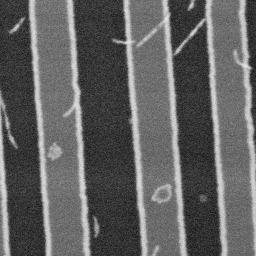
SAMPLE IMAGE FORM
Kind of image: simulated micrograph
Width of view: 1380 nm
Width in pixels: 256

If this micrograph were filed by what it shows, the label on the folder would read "lines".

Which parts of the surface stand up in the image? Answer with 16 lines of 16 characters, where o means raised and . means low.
..oo....oo...oo.
..oo....oo...oo.
..ooo...ooo..oo.
..ooo...ooo..oo.
..ooo...ooo..oo.
..ooo...ooo..ooo
..ooo...ooo..ooo
..ooo...ooo..ooo
...oo...ooo...oo
...oo....oo...oo
...oo....oo...oo
...oo....oo...oo
...oo....oo...oo
...oo....oo...oo
...oo....oo...oo
...oo....oo...oo